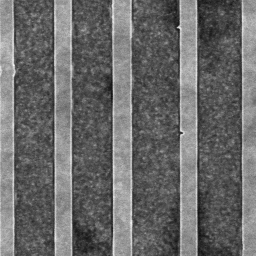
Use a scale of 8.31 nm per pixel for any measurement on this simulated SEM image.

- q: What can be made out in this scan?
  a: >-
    one or a few lines or trenches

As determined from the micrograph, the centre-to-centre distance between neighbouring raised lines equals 521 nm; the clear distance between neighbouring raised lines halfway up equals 361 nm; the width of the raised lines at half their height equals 0.14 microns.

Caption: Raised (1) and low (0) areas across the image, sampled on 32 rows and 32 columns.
11000001100000110000000110000011
11000001100000110000000110000011
11000001100000110000000110000011
11000001100000110000001110000011
11000001100000110000000110000011
11000001100000110000000110000011
11000001100000110000000110000011
11000001100000110000000110000011
11000001100000110000000110000011
11000001100000110000000110000011
11000001100000110000000100000011
11000001100000110000000100000011
11000001100000110000000100000011
11000001100000110000000110000011
11000001100000110000000110000011
11000001100000110000000110000011
11000001100000110000000110000011
11000001100000110000000110000011
11000001100000110000000110000011
11000001100000110000000110000011
11000001100000110000000110000011
11000001100000110000000110000011
11000001100000110000000110000011
11000001100000110000000110000011
11000001100000110000000110000011
11000001100000110000000110000011
11000001100000110000000110000011
11000001100000110000000110000011
11000001100000110000000110000011
11000001100000110000000110000011
11000001100000110000000110000011
11000001100000110000000110000011